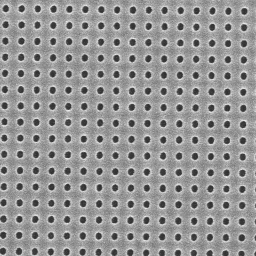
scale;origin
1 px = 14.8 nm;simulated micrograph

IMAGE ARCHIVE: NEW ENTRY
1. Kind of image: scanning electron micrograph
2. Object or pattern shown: a regular array of holes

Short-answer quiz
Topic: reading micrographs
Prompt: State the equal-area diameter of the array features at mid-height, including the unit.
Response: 107 nanometers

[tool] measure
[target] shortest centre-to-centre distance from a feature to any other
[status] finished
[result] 0.234 micrometres